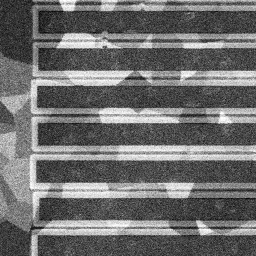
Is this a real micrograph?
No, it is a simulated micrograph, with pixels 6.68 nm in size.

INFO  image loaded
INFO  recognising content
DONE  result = parallel lines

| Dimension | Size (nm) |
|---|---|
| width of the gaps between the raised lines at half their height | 189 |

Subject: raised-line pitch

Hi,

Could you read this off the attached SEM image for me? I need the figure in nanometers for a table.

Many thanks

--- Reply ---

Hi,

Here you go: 250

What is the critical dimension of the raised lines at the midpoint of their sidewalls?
59.2 nanometers